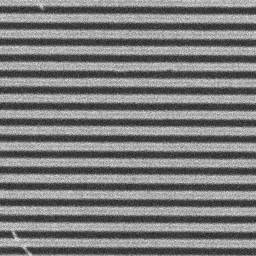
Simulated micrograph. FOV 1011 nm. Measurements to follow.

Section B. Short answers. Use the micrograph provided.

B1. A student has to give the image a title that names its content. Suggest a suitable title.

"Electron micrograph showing parallel lines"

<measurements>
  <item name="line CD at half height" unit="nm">25.2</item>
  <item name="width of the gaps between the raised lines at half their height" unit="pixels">9.11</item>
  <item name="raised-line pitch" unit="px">16.1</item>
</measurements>